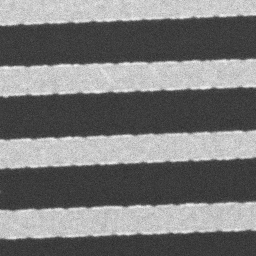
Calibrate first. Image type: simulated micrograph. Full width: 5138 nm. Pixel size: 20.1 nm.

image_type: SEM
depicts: lines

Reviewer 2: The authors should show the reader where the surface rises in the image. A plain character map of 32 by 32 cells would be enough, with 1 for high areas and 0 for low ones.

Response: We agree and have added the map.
11111111111111111111111111111111
11111111111111111111111111111111
11111111111111100000000000000000
00000000000000000000000000000000
00000000000000000000000000000000
00000000000000000000000000000000
00000000000000000000000000000000
00000000000000000000000000000011
11111111111111111111111111111111
11111111111111111111111111111111
11111111111111111111111111111111
11111111110000000000000000000000
00000000000000000000000000000000
00000000000000000000000000000000
00000000000000000000000000000000
00000000000000000000000000000000
00000000000000000000000000000001
00001111111111111111111111111111
11111111111111111111111111111111
11111111111111111111111111111111
11111111111100000000000000000000
00000000000000000000000000000000
00000000000000000000000000000000
00000000000000000000000000000000
00000000000000000000000000000000
00000000000000000000000000111111
11111111111111111111111111111111
11111111111111111111111111111111
11111111111111111111111111111111
11111110000000000000000000000000
00000000000000000000000000000000
00000000000000000000000000000000